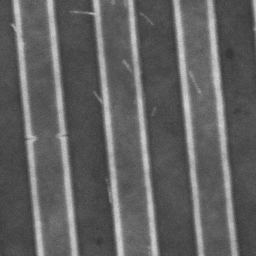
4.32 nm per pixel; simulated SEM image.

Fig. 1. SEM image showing one or a few lines or trenches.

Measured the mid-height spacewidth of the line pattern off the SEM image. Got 0.199 micrometres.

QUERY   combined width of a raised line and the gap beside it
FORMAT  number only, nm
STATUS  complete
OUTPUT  344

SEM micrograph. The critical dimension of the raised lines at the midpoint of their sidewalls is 0.146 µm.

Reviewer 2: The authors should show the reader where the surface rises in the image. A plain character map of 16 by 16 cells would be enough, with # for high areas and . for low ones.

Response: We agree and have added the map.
.##...##...##...
.##...##...##...
.##...##...##...
.##...##...##...
.###..###..##...
..##...##...##..
..##...##...##..
..##...##...##..
..##...##...##..
..##...##...##..
..##...##...##..
..##...##...##..
..##...##...##..
..##...##...##..
..###..###..##..
..###...##...##.